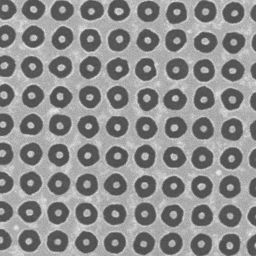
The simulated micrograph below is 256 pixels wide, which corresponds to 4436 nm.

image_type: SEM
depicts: a regular array of ring-shaped grooves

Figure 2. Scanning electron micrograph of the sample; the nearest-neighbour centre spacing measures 0.483 µm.